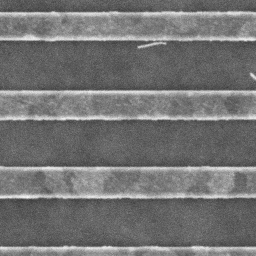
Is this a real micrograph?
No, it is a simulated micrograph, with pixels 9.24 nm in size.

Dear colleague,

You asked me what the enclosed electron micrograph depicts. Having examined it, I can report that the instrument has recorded lines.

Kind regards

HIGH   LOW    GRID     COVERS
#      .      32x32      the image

................................
................................
################################
################################
################################
................................
................................
................................
................................
................................
................................
................................
################################
################################
################################
................................
................................
................................
................................
................................
................................
################################
################################
################################
################################
................................
................................
................................
................................
................................
................................
################################